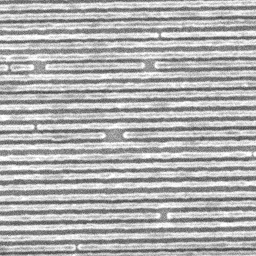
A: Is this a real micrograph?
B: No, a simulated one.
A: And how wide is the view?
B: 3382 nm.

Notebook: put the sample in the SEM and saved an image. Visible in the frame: parallel lines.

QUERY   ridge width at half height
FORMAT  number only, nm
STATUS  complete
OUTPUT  57.8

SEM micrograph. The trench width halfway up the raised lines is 0.0693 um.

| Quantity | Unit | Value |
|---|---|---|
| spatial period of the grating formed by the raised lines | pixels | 10.1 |